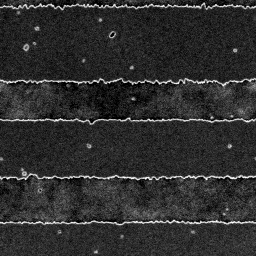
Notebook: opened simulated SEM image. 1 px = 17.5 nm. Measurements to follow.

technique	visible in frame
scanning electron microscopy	one or a few lines or trenches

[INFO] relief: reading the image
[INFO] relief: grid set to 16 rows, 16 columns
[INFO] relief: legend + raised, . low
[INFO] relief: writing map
++++++++++++++++
++++++++++++++++
++++++++++++++++
++++++++++++++++
++++++++++++++++
................
................
.+++..+++.+++.++
++++++++++++++++
++++++++++++++++
++++++++++++++++
................
................
................
++++++++++++++++
++++++++++++++++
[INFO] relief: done